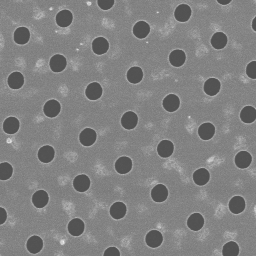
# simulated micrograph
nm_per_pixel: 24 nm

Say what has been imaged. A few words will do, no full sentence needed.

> a regular array of holes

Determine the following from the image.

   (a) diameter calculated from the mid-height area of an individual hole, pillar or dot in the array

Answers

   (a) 424 nm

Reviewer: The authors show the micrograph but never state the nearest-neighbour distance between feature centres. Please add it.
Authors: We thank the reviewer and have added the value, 1080 nanometres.